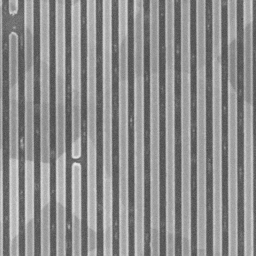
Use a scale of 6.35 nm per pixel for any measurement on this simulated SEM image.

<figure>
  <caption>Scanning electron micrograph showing parallel lines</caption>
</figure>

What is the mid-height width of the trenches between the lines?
50.8 nm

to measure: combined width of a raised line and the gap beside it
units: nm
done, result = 99.4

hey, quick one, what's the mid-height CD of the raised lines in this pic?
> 0.0508 µm